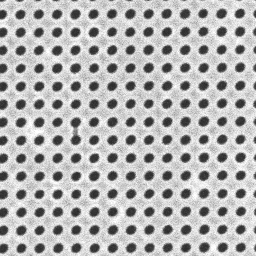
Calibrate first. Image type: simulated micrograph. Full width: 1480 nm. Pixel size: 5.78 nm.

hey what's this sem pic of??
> a regular array of holes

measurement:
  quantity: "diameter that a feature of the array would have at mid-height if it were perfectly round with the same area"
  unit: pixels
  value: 10.3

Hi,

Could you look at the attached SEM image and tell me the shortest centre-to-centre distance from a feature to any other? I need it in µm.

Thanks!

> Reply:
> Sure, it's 0.102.